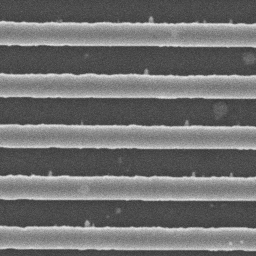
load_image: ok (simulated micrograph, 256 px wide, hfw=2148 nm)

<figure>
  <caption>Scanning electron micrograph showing lines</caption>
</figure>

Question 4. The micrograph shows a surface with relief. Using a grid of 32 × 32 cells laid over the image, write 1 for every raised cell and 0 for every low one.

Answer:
00000000000000000000000000000000
00000000000000000000000000000000
00000000000000000000000000000000
11111111111111111111111111111111
11111111111111111111111111111111
11111111111111111111111111111111
00000000000000000000000000000000
00000000000000000000000000000000
00000000000000000000000000000000
11111111111111111111110111111101
11111111111111111111111111111111
11111111111111111111111111111111
00000000000000000000000000000000
00000000000000000000000000000000
00000000000000000000000000000000
00000000000000000000000000000000
11111111111111111111111111111111
11111111111111111111111111111111
00000000000011101111111111111111
00000000000000000000000000000000
00000000000000000000000000000000
00000000000000000000000000000000
11111111111111111111111111111111
11111111111111111111111111111111
11111111111111111111111111111111
00000000000000000000000000000000
00000000000000000000000000000000
00000000000000000000000000000000
11111111111111111111101111111110
11111111111111111111111111111111
11111111111111111111111111111111
00000000000000000000000000000000